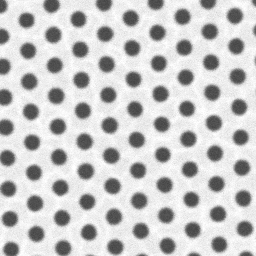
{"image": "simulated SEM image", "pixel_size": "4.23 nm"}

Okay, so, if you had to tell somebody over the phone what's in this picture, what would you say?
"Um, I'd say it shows a regular array of holes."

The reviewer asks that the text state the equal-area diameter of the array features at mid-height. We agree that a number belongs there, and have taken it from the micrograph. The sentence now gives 66.9 nm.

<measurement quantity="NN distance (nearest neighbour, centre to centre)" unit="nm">126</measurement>